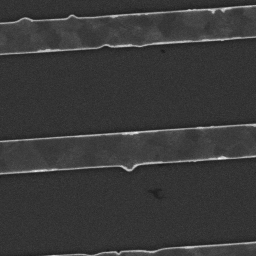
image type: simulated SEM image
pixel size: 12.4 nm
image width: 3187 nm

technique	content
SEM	one or a few lines or trenches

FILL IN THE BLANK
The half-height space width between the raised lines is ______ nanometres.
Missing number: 1070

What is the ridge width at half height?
410 nm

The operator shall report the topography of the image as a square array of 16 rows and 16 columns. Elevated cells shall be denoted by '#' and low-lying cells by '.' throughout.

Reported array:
..............##
################
##############..
................
................
................
................
................
.....###########
################
######..........
................
................
................
................
...........#####